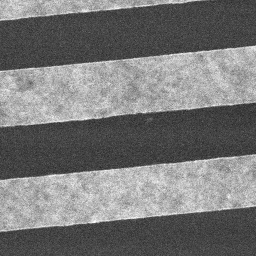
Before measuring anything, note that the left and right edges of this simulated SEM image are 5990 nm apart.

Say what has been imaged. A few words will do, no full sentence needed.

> one or a few lines or trenches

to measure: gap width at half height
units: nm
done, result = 1230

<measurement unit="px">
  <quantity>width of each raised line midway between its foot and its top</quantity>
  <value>52.6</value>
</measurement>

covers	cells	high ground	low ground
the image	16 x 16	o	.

oooooooo........
................
................
..........oooooo
oooooooooooooooo
oooooooooooooooo
ooooooooooooooo.
ooooo...........
................
................
........oooooooo
oooooooooooooooo
oooooooooooooooo
oooooooooo......
................
................